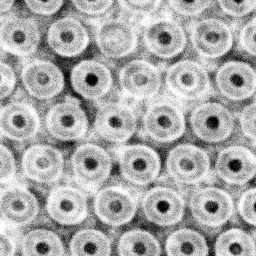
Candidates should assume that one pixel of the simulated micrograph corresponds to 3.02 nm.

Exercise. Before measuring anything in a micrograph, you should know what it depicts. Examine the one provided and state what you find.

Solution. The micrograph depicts a regular array of ring-shaped raised bodies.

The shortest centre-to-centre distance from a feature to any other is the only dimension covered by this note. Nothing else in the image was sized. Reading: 145 nanometres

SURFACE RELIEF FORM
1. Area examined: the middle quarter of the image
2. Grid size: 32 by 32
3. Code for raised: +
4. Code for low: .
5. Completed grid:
...+++++++.....+++++++.....+++++
..+++++++++....++++++++....+++++
..++++..+++...++++..++++..++++..
..+++....+++..+++....+++..+++...
..+++....+++..+++....+++..+++...
..++++..+++...++++..++++..+++++.
...++++++++....++++++++....+++++
....++++++......++++++......++++
..............................++
................................
+++.......+++++.......+++++.....
++++.....+++++++.....+++++++....
+++++...+++++++++....++++++++...
...++...+++...++++..+++....+++..
...+++..+++....+++..+++....+++..
..++++..+++...++++..++++...+++..
++++++..++++++++++...+++++++++..
+++++....++++++++....++++++++...
+++.......++++++......++++++....
................................
.....+++.....................+++
...+++++++.....+++++++.....+++++
...++++++++...+++++++++...++++++
..++++..+++...++++..++++..++++.+
..+++....+++..+++....+++..+++...
..+++...++++..+++....+++..+++...
..++++.++++...++++..++++..++++..
...++++++++....++++++++....+++++
....++++++......++++++......++++
......+++.........+++.........++
................................
+++.......++++........+++++.....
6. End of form